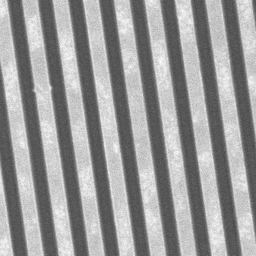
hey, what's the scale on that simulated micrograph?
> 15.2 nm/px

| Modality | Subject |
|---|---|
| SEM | parallel lines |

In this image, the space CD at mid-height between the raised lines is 0.202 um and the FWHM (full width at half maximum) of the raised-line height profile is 258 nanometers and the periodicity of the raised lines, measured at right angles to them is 461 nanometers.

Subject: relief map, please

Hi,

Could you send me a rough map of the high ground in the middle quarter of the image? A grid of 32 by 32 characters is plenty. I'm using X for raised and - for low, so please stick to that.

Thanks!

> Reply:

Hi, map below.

XXXX---XXXX----XXXX---XXXX----XX
XXXX---XXXX----XXXX---XXXXX---XX
XXXX---XXXXX---XXXX----XXXX---XX
XXXX----XXXX---XXXX----XXXX---XX
XXXX----XXXX---XXXX----XXXX----X
XXXX----XXXX---XXXXX---XXXX----X
XXXX----XXXX----XXXX---XXXX----X
XXXXX---XXXX----XXXX---XXXX----X
-XXXX---XXXX----XXXX---XXXXX---X
-XXXX---XXXXX---XXXX----XXXX---X
-XXXX----XXXX---XXXX----XXXX---X
-XXXX----XXXX---XXXX----XXXX----
-XXXX----XXXX---XXXXX---XXXX----
-XXXX----XXXX----XXXX---XXXX----
-XXXXX---XXXX----XXXX---XXXXX---
--XXXX---XXXX----XXXX---XXXXX---
--XXXX---XXXXX---XXXX----XXXX---
--XXXX----XXXX---XXXX----XXXX---
--XXXX----XXXX---XXXX----XXXX---
--XXXX----XXXX---XXXXX---XXXX---
--XXXX----XXXX----XXXX---XXXX---
--XXXXX---XXXX----XXXX---XXXXX--
---XXXX---XXXX----XXXX---XXXXX--
---XXXX---XXXXX---XXXX----XXXX--
---XXXX----XXXX---XXXX----XXXX--
---XXXX----XXXX---XXXX----XXXX--
---XXXX----XXXX---XXXXX---XXXX--
---XXXX----XXXX----XXXX---XXXX--
---XXXXX---XXXX----XXXX---XXXXX-
----XXXX---XXXX----XXXX----XXXX-
----XXXX---XXXXX---XXXX----XXXX-
----XXXX----XXXX---XXXX----XXXX-